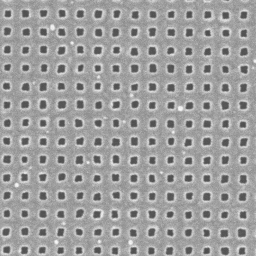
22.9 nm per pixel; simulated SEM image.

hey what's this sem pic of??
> a regular array of holes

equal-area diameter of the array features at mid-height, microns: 0.183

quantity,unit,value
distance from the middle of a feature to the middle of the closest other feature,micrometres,0.402